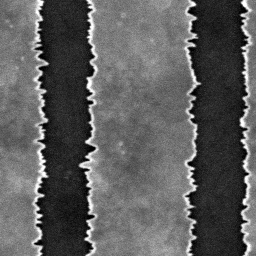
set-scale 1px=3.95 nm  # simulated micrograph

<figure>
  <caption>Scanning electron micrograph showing one or a few lines or trenches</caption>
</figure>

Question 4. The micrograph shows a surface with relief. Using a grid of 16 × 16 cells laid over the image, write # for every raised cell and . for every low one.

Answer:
###...######...#
##....######...#
##....######...#
###...######...#
###...######...#
###...######...#
###...######...#
###...######...#
###...######...#
###...######...#
###..#######...#
##....######...#
##....######...#
##....######...#
##....######...#
##....######...#